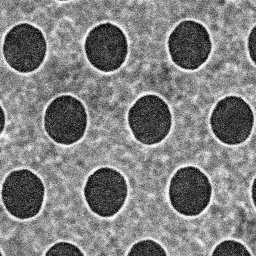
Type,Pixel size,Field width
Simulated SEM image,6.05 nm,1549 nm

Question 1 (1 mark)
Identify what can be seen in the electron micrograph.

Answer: a regular array of holes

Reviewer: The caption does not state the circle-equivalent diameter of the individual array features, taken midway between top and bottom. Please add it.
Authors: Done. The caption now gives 287 nm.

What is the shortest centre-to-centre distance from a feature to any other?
0.497 microns